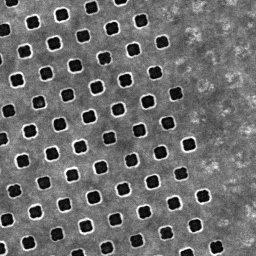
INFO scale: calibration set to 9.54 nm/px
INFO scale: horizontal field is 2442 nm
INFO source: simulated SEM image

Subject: a regular array of holes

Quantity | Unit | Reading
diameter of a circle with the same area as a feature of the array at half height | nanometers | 131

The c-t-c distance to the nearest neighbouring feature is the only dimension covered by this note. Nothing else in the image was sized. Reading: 0.283 µm